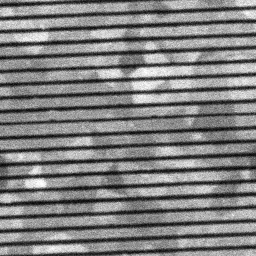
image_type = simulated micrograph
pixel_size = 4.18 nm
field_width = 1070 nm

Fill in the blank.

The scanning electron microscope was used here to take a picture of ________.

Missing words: parallel lines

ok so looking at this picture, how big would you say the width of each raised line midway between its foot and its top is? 8.61 pixels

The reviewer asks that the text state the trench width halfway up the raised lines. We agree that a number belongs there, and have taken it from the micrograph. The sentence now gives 19.8 nm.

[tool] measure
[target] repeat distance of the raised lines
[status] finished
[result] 55.5 nanometers